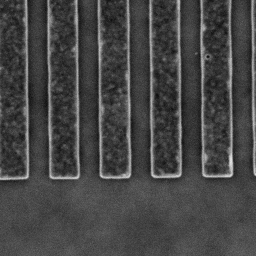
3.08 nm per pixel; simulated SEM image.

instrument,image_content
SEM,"wiring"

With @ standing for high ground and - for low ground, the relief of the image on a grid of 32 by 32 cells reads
@@@---@@@@--@@@@---@@@---@@@@---
@@@---@@@@--@@@@---@@@---@@@@---
@@@---@@@@--@@@@---@@@---@@@@---
@@@---@@@@--@@@@---@@@---@@@@---
@@@---@@@@--@@@@---@@@---@@@@---
@@@---@@@@--@@@@---@@@---@@@@---
@@@---@@@@--@@@@---@@@---@@@@---
@@@---@@@@--@@@@---@@@@--@@@@---
@@@---@@@@--@@@@---@@@@--@@@@---
@@@---@@@@--@@@@---@@@@--@@@@---
@@@---@@@@--@@@@---@@@@--@@@@---
@@@---@@@@--@@@@---@@@@--@@@@---
@@@---@@@@--@@@@---@@@@--@@@@---
@@@---@@@@--@@@@---@@@@--@@@@---
@@@---@@@@--@@@@---@@@@--@@@@---
@@@---@@@@--@@@@---@@@@--@@@@---
@@@---@@@@--@@@@---@@@@--@@@@---
@@@---@@@@---@@@---@@@@--@@@@---
@@@---@@@@---@@@---@@@@--@@@@---
@@@---@@@@---@@@---@@@@--@@@@---
@@@---@@@@---@@@---@@@@--@@@@---
@@@---@@@@---@@@---@@@@--@@@@---
--------------------------------
--------------------------------
--------------------------------
--------------------------------
--------------------------------
--------------------------------
--------------------------------
--------------------------------
--------------------------------
--------------------------------